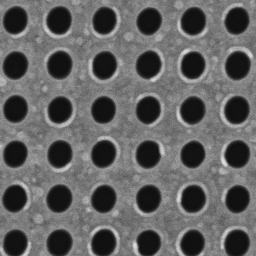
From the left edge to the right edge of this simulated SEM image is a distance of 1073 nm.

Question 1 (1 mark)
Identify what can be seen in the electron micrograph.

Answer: a regular array of holes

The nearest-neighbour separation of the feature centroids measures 185 nm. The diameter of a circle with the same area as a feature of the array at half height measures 24.9 px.